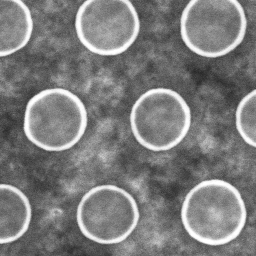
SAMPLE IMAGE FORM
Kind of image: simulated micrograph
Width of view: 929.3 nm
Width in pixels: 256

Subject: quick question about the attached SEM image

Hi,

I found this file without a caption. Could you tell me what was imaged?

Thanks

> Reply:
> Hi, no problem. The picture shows raised bodies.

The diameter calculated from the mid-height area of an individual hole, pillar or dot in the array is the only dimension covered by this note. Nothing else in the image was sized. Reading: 59.1 px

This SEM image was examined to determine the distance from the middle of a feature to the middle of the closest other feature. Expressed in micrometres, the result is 0.384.